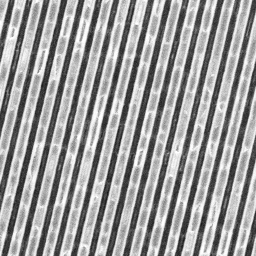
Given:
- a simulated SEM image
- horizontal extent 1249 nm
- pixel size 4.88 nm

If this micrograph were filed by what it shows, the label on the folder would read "parallel lines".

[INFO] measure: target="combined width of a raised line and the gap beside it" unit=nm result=82.6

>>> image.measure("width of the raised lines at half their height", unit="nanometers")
51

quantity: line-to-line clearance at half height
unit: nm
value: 32.7